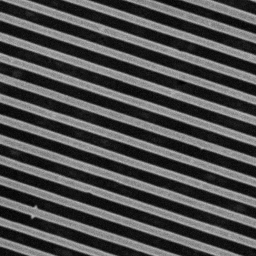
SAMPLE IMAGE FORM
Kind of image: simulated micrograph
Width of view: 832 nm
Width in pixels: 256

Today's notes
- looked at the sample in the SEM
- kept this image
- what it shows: parallel lines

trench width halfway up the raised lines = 0.0379 um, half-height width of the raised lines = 0.0262 microns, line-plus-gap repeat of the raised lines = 0.0633 microns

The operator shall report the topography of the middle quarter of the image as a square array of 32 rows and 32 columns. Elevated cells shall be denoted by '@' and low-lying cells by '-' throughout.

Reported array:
---@@@@@@----------@@@@@@-------
------@@@@@@----------@@@@@@----
---------@@@@@@@---------@@@@@@-
@@@---------@@@@@@----------@@@@
@@@@@@---------@@@@@@----------@
---@@@@@@---------@@@@@@--------
------@@@@@@---------@@@@@@@----
---------@@@@@@---------@@@@@@@-
@@----------@@@@@@---------@@@@@
@@@@@----------@@@@@@---------@@
---@@@@@----------@@@@@@--------
------@@@@@----------@@@@@@-----
---------@@@@@----------@@@@@@--
@@----------@@@@@----------@@@@@
@@@@@----------@@@@@----------@@
--@@@@@@----------@@@@@@--------
-----@@@@@@@---------@@@@@@-----
--------@@@@@@@---------@@@@@@--
@@---------@@@@@@@---------@@@@@
@@@@@---------@@@@@@@---------@@
--@@@@@@---------@@@@@@---------
-----@@@@@@---------@@@@@@@-----
--------@@@@@@---------@@@@@@@--
@----------@@@@@@---------@@@@@@
@@@@----------@@@@@@---------@@@
--@@@@@----------@@@@@@---------
-----@@@@@----------@@@@@@------
--------@@@@@----------@@@@@@---
@----------@@@@@@---------@@@@@@
@@@@----------@@@@@----------@@@
-@@@@@@---------@@@@@@----------
----@@@@@@----------@@@@@@------